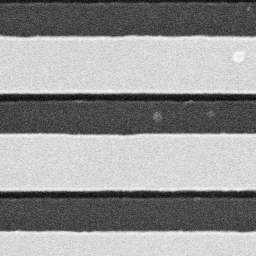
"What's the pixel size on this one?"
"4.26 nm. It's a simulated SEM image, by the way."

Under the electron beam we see lines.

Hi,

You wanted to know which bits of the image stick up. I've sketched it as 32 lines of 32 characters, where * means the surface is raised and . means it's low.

................................
................................
................................
................................
...............****.....**......
********************************
********************************
********************************
********************************
********************************
********************************
********************************
................................
................................
................................
................................
................................
********************************
********************************
********************************
********************************
********************************
********************************
********************************
................................
................................
................................
................................
................................
********************************
********************************
********************************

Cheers